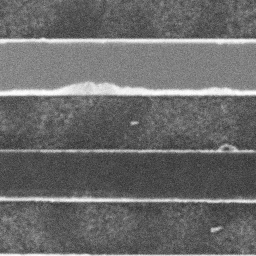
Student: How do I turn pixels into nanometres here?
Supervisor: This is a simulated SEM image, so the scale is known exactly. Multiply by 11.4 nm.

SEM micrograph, lines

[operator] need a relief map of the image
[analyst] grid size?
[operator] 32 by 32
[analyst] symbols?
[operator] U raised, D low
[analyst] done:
DDDDDDDDDDDDDDDDDDDDDDDDDDDDDDDD
DDDDDDDDDDDDDDDDDDDDDDDDDDDDDDDD
DDDDDDDDDDDDDDDDDDDDDDDDDDDDDDDD
DDDDDDDDDDDDDDDDDDDDDDDDDDDDDDDD
DDDDDDDDDDDDDDDDDDDDDDDDDDDDDDDD
UUUUUUUUUUUUUUUUUUUUUUUUUUUUUUUU
UUUUUUUUUUUUUUUUUUUUUUUUUUUUUUUU
UUUUUUUUUUUUUUUUUUUUUUUUUUUUUUUU
UUUUUUUUUUUUUUUUUUUUUUUUUUUUUUUU
UUUUUUUUUUUUUUUUUUUUUUUUUUUUUUUU
UUUUUUUUUUUUUUUUUUUUUUUUUUUUUUUU
UUUUDUUDDDDDDDDDDDDUDDDDDDDDDUUU
DDDDDDDDDDDDDDDDDDDDDDDDDDDDDDDD
DDDDDDDDDDDDDDDDDDDDDDDDDDDDDDDD
DDDDDDDDDDDDDDDDDDDDDDDDDDDDDDDD
DDDDDDDDDDDDDDDDDDDDDDDDDDDDDDDD
DDDDDDDDDDDDDDDDDDDDDDDDDDDDDDDD
DDDDDDDDDDDDDDDDDDDDDDDDDDDDDDDD
DDDDDDDDDDDDDDDDDDDDDDDDDDDDDDDD
UUUUUUUUUUUUUUUUUUUUUUUUUUUUUUUU
UUUUUUUUUUUUUUUUUUUUUUUUUUUUUUUU
UUUUUUUUUUUUUUUUUUUUUUUUUUUUUUUU
UUUUUUUUUUUUUUUUUUUUUUUUUUUUUUUU
UUUUUUUUUUUUUUUUUUUUUUUUUUUUUUUU
UUUUUUUUUUUUUUUUUUUUUUUUUUUUUUUU
DDDDDDDDDDDDDDDDDDDDDDDDDDDDDDDD
DDDDDDDDDDDDDDDDDDDDDDDDDDDDDDDD
DDDDDDDDDDDDDDDDDDDDDDDDDDDDDDDD
DDDDDDDDDDDDDDDDDDDDDDDDDDDDDDDD
DDDDDDDDDDDDDDDDDDDDDDDDDDDDDDDD
DDDDDDDDDDDDDDDDDDDDDDDDDDDDDDDD
DDDDDDDDDDDDDDDDDDDDDDDDDDDDDDDD